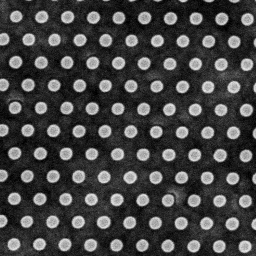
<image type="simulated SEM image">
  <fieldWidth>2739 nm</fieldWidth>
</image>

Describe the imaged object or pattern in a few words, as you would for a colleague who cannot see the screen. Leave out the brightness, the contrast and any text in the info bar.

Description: a regular array of raised bodies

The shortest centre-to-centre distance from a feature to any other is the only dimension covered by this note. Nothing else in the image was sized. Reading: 274 nm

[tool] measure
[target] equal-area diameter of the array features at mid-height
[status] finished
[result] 0.125 microns